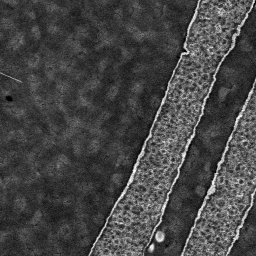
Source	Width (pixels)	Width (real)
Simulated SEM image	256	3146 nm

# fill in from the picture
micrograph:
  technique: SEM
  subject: one or a few lines or trenches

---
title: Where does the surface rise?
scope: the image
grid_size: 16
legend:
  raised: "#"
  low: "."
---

............####
............###.
............###.
...........###..
...........###..
..........###...
..........###..#
..........##...#
.........###..##
.........###..##
........###...##
........###..###
.......###...###
.......###..###.
......####..###.
......###...##..